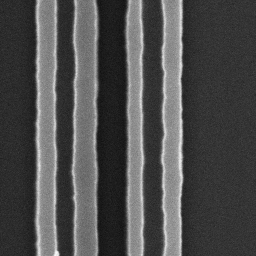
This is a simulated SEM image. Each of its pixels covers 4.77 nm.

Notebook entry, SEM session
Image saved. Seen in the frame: lines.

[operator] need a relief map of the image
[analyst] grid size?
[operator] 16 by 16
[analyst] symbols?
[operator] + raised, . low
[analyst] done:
..++++..+++.....
..++++..+++.....
..++++..+++.....
..++++..+++.....
..++++..+++.....
..++++..+++.....
..++++..+++.....
..++++..+++.....
..++++..+++.....
..++++..+++.....
..++++..+++.....
..++++..+++.....
..++++..+++.....
..++++..+++.....
..++++..+++.....
..++++..+++.....